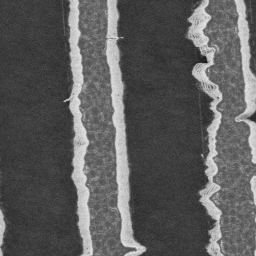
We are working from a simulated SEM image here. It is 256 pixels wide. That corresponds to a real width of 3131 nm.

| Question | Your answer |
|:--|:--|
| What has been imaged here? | one or a few lines or trenches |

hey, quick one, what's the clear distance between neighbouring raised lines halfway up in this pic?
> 1110 nanometers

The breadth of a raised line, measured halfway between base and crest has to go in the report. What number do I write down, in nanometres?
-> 480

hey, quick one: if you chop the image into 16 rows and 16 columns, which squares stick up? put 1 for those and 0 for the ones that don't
0000011000000110
0000011000001110
0000011000000110
0000011000000110
0000011000001110
0000011000000111
0000011000000111
0000011000000011
0000011000000111
0000011100000111
0000011100000111
0000011100000111
0000011100000111
0000011100000111
0000011100000011
0000001110000011